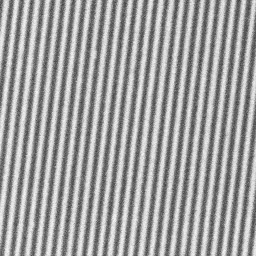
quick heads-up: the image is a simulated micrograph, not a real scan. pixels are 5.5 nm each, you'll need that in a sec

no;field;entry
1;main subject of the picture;parallel lines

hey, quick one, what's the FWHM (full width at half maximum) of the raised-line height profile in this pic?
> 20.4 nm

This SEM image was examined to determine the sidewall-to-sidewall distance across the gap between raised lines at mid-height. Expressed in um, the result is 0.0354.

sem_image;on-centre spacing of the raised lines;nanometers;56.4